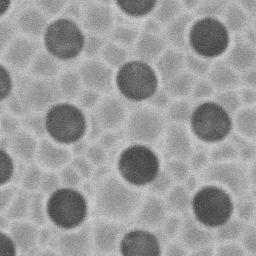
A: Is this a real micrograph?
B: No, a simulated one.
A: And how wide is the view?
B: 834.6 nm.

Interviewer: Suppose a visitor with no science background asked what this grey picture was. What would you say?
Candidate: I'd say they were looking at a regular array of holes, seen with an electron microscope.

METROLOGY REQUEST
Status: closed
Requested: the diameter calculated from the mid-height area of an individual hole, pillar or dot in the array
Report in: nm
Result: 135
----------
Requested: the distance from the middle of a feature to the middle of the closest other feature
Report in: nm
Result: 273